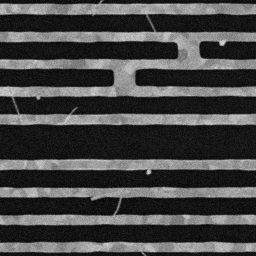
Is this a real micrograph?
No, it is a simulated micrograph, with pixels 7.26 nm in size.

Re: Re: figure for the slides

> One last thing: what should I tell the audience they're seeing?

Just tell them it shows groups of lines, slits or small figures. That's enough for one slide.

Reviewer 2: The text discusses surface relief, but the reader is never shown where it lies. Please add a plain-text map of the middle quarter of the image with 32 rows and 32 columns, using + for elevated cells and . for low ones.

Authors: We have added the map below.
++++++++++++++++++++++++++++++++
............++++++..............
.............+++++..............
.............+++++..............
.............+++++..............
............++++++..............
++++++++++++++++++++++++++++++++
++++++++++++++++++++++++++++++++
................................
................................
................................
................................
................................
++++++++++++++++++++++++++++..++
++++++++++++++++++++++++++++++++
................................
................................
................................
................................
................................
................................
................................
................................
................................
++++++++++++++++++++++++++++++++
++++++++++++++++++++++++++++++++
.....................+..........
................................
................................
................................
................................
++++++++++++++++++++++++++++++++